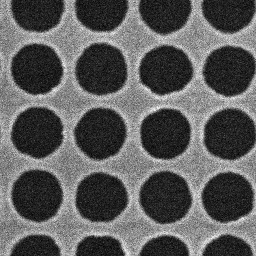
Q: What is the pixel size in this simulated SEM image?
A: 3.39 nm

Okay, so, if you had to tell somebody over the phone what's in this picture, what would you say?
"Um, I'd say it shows a regular array of holes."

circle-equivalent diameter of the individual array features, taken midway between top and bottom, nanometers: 176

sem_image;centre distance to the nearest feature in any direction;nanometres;214